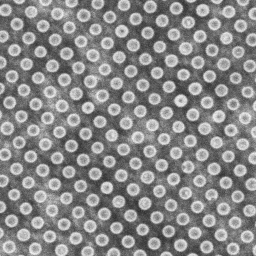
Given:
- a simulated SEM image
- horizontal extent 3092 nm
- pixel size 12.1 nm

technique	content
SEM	a regular array of raised bodies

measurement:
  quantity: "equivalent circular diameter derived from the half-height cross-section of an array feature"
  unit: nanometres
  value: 139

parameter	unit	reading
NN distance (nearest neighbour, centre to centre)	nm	220